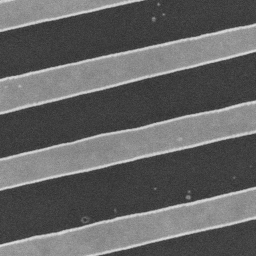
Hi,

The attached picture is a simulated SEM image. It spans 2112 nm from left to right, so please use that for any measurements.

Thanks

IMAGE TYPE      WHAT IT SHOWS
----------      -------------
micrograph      lines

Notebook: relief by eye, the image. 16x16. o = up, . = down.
ooooooo.........
oo..............
...........ooooo
.......oooooooo.
..ooooooooo.....
ooooooo.........
ooo............o
..........oooooo
......ooooooooo.
..ooooooooo.....
oooooo..........
oo..............
.............ooo
........oooooooo
....oooooooo....
oooooooo........